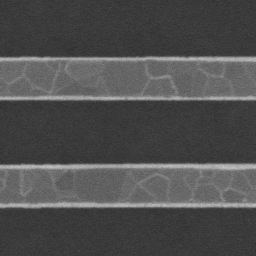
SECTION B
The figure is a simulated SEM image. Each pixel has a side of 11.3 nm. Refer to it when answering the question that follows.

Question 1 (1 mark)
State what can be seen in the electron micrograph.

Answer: lines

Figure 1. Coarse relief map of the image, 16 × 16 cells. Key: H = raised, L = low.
LLLLLLLLLLLLLLLL
LLLLLLLLLLLLLLLL
LLLLLLLLLLLLLLLL
LLLLLLLLLLLLLLLL
HHHHHHHHHHHHHHHH
HHHHHHHHHHHHHHHH
LLLLLLLLLLLLLLLL
LLLLLLLLLLLLLLLL
LLLLLLLLLLLLLLLL
LLLLLLLLLLLLLLLL
HHHHHHHHHHHHHHHH
HHHHHHHHHHHHHHHH
HHHHHHHHHHHHHHHH
LLLLLLLLLLLLLLLL
LLLLLLLLLLLLLLLL
LLLLLLLLLLLLLLLL